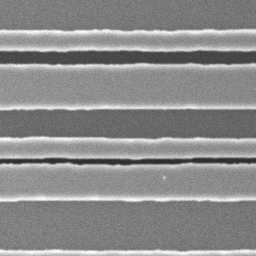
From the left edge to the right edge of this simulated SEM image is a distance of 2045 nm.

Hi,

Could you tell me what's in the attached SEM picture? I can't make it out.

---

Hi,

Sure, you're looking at lines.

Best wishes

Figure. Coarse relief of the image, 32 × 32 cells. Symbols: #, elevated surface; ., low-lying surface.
................................
................................
................................
................................
################################
################################
................................
................................
################################
################################
################################
################################
################################
################################
................................
................................
................................
##################.#############
################################
################################
#########.............##########
################################
################################
################################
################################
................................
................................
................................
................................
................................
................................
#####################...#.######